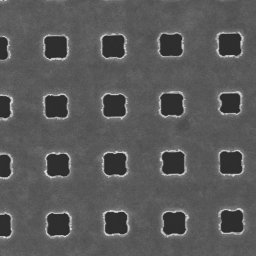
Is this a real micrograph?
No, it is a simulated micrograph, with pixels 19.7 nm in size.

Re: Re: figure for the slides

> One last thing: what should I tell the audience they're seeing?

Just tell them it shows a regular array of holes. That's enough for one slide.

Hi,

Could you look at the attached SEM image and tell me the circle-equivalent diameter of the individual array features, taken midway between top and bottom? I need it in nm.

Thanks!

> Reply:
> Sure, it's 485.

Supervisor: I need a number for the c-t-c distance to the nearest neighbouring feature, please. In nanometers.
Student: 1130